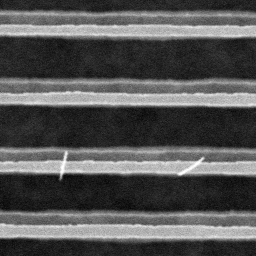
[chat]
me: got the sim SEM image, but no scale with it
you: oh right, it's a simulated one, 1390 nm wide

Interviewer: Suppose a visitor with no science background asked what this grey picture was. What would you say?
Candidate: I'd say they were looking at lines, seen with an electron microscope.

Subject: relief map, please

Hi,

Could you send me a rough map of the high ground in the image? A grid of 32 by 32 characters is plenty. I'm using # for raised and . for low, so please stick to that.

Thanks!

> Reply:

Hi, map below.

................................
................................
################################
################################
.................####......####.
................................
................................
................................
................................
................................
################################
################################
################################
................................
................................
................................
................................
................................
................................
################################
################################
...#############################
................................
................................
................................
................................
................................
################################
################################
################################
................................
................................